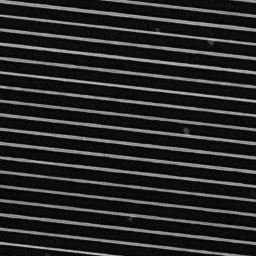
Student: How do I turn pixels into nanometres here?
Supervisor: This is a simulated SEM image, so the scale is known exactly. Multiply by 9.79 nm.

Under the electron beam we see parallel lines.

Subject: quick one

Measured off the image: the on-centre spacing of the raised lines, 138 nanometers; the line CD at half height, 2.73 px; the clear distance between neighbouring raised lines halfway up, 0.115 microns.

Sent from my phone